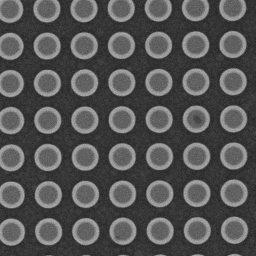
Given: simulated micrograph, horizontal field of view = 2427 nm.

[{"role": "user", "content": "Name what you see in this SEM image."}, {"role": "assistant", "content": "an array of small figures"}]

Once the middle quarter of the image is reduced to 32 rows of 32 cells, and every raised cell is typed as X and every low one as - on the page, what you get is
--------------------------------
-----X-------XX--------XX-------
---XXXXX----XXXXX----XXXXX----XX
--XXXXXX---XXXXXX----XXXXXX---XX
--XXXXXX---XXXXXXX--XXXXXXX---XX
--XXXXXX---XXXXXXX--XXXXXXX---XX
--XXXXXX----XXXXX----XXXXX----XX
---XXXX------XXX------XXX-------
--------------------------------
--------------------------------
--------------------------------
---XXXX-----XXXXX----XXXXX-----X
--XXXXXX----XXXXX----XXXXXX---XX
--XXXXXX---XXXXXXX---XXXXXX---XX
--XXXXXX---XXXXXXX---XXXXXX---XX
--XXXXXX----XXXXX----XXXXXX---XX
---XXXX-----XXXXX-----XXXX-----X
--------------------------------
--------------------------------
--------------------------------
----XXX------XXX------XXXX-----X
---XXXXX----XXXXX----XXXXXX---XX
--XXXXXXX--XXXXXXX---XXXXXX---XX
--XXXXXXX--XXXXXXX---XXXXXX---XX
--XXXXXX----XXXXXX---XXXXXX---XX
---XXXXX----XXXXX-----XXXX-----X
----XX--------------------------
--------------------------------
--------------------------------
----XX-------XXX------XXX-------
---XXXXX----XXXXX----XXXXXX---XX
--XXXXXX---XXXXXXX---XXXXXX---XX